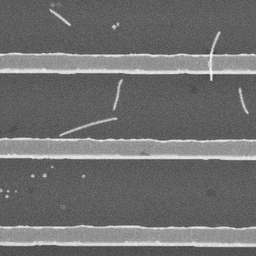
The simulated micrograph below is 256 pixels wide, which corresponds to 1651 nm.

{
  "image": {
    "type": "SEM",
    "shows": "lines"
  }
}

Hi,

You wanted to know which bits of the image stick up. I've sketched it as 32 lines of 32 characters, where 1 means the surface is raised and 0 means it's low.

00000000000000000000000000000000
00000000000000000000000000000000
00000000000000000000000000000000
00000000000000000000000000000000
00000000000000000000000000000000
00000000000000000000000000000000
00000000000000000000000000000000
11111111111111111111111111111111
11111111111111111111111111111111
00000000000000000000000000000000
00000000000000000000000000000000
00000000000000000000000000000000
00000000000000000000000000000000
00000000000000000000000000000000
00000000000000000000000000000000
00000000000000000000000000000000
00000000000000000000000000000000
11111111111101111010000000000000
11111111111111111111111111111111
11111111111111111111111111111111
00000000000000000000000000000000
00000000000000000000000000000000
00000000000000000000000000000000
00000000000000000000000000000000
00000000000000000000000000000000
00000000000000000000000000000000
00000000000000000000000000000000
00000000000000000000000000000000
11111111111111111100011111011001
11111111111111111111111111111111
11111111111111111111111111111111
00000000000000000000000000000000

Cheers